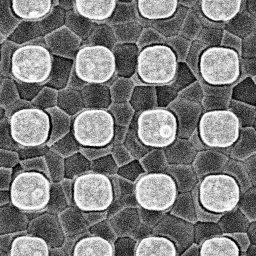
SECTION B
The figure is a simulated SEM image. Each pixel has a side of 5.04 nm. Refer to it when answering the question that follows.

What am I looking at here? a regular array of raised bodies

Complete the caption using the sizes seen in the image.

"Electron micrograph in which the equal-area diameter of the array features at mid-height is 194 nm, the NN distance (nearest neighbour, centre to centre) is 0.316 um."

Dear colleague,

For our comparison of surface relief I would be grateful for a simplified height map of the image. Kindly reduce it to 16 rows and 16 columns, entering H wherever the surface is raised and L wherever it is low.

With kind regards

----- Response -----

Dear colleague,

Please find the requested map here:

LHHLLHHLLHHLLHHL
LLLLLLLLLLLLLLLL
LLLLLLLLLLLLLLLL
LHHLLHHLLHHLLHHL
LHHLLHHLLHHLLHHL
LLLLLLLLLLLLLLLL
LLLLLLLLLLLLLLLL
LHHLLHHLLHHLLHHL
LHHLLHHLLHHLLHHL
LLLLLLLLLLLLLLLL
LLLLLLLLLLLLLLLL
LHHLLHHLLHHLLHHL
LHHLLHHLLHHLLHHL
LLLLLLLLLLLLLLLL
LLLLLLLLLLLLLLLL
LHHLLHHLLHHLLHHL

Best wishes